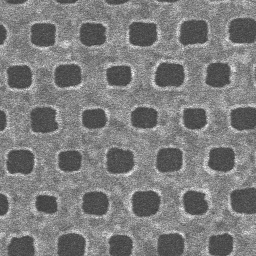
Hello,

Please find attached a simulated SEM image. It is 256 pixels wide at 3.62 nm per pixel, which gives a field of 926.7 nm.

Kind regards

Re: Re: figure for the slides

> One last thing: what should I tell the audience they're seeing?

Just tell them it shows a regular array of holes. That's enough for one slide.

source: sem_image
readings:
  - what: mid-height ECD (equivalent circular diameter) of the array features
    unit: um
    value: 0.0946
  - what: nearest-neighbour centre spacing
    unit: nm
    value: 176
